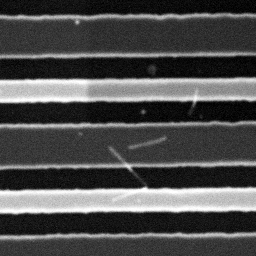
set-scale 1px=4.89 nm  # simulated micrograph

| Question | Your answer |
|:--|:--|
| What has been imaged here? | lines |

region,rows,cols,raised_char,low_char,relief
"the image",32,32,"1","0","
00000000000000000000000000000000
00000000000000000000000000000000
11111111111111111111111111111111
11111111111111111111111111111111
11111111111111111111111111111111
11111111111111111111111111111111
11111111111111111111111111111111
00000000000000000000000000000000
00000000000000000000000000000000
00000000000000000000000000000000
11111111111111111111111111111111
11111111111111111111111111111111
11111111111111111111111111111111
00000000000000000000000000000000
00000000000000000000000000000000
00000000000001000111111111111111
11111111111111111111111111111111
11111111111111111111111111111111
11111111111111111111111111111111
11111111111111111111111111111111
11111111111111111111111111111111
00000000000000000000000000000000
00000000000000000000000000000000
00000000000000000000000000001000
11111111111111111111111111111111
11111111111111111111111111111111
11111110000000000000000000000000
00000000000000000000000000000000
00000000000000000000000000000000
10011111111111111111111111111111
11111111111111111111111111111111
11111111111111111111111111111111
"